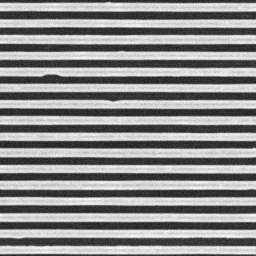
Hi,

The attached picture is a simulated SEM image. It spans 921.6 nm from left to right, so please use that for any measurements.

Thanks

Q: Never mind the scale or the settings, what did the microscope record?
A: parallel lines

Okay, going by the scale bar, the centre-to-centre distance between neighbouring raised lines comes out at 58.2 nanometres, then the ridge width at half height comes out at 28.3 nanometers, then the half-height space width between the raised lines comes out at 28.3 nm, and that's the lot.